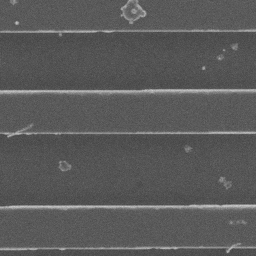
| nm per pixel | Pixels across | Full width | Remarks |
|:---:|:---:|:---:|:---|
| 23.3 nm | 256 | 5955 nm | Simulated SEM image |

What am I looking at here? lines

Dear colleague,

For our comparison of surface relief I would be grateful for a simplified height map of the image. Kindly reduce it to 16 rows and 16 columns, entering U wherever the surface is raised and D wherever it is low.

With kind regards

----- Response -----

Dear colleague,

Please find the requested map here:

UUUUUUUUUUUUUUUU
UUUUUUUUUUUUUUUU
DDDDDDDDDDDDDDDD
DDDDDDDDDDDDDDDD
DDDDDDDDDDDDDDDD
DDDDDDDDDDDDDDDD
UUUUUUUUUUUUUUUU
UUUUUUUUUUUUUUUU
DDDDDDDDDDDDDDDD
DDDDDDDDDDDDDDDD
DDDDDDDDDDDDDDDD
DDDDDDDDDDDDDDDD
DDDDDDDDDDDDDDDD
UUUUUUUUUUUUUUUU
UUUUUUUUUUUUUUUU
UUUUUUUUUUUUDDUD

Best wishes